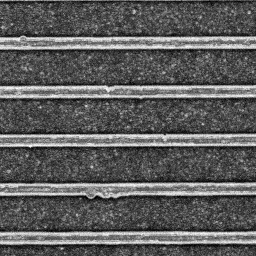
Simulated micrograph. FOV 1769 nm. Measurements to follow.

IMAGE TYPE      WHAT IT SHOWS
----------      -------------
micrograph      parallel lines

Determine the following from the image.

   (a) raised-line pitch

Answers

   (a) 337 nm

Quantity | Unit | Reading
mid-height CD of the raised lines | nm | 62.2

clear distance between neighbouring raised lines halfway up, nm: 274